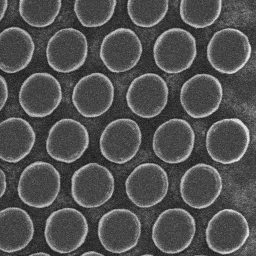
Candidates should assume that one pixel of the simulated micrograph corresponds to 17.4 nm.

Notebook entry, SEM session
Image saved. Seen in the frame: a regular array of raised bodies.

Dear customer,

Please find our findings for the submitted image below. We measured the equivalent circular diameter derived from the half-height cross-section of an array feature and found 0.735 um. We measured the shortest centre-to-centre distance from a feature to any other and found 906 nm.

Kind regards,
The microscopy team